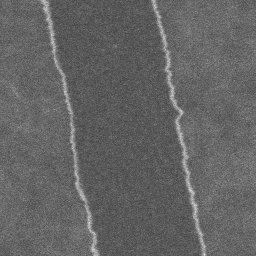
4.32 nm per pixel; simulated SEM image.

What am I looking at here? one or a few lines or trenches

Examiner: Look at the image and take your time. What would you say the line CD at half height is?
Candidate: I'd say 467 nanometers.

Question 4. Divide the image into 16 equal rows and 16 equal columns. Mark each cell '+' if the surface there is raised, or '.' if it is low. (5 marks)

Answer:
...+++++++......
...+++++++......
...+++++++......
...+++++++......
....+++++++.....
....+++++++.....
....+++++++.....
....+++++++.....
....+++++++.....
.....+++++++....
.....+++++++....
.....+++++++....
.....+++++++....
......++++++....
......++++++....
......+++++++...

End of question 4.